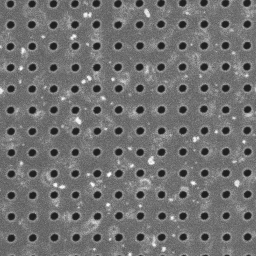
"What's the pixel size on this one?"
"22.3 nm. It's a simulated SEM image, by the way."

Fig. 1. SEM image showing a regular array of holes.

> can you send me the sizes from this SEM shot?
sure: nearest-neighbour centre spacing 464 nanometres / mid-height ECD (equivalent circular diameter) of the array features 7.9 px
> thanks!